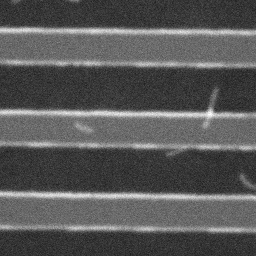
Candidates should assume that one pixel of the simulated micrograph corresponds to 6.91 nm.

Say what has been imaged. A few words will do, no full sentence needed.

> lines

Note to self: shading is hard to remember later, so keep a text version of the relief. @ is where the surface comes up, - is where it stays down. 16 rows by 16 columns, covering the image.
----------------
----------------
@@@@@@@@@@@@@@@@
@@@@@@@@@@@@@@@@
----------------
----------------
----------------
@@@@@@@@@@@@@@@@
@@@@@@@@@@@@@@@@
----------------
----------------
----------------
@@@@@@@@@@@@@@@@
@@@@@@@@@@@@@@@@
----------------
----------------